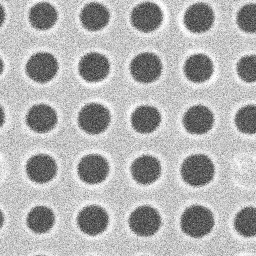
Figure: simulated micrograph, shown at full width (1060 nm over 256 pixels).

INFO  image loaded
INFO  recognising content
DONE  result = a regular array of holes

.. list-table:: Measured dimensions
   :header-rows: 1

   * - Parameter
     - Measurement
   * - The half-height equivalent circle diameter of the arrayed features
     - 140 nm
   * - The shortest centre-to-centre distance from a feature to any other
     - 210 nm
